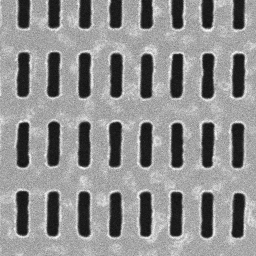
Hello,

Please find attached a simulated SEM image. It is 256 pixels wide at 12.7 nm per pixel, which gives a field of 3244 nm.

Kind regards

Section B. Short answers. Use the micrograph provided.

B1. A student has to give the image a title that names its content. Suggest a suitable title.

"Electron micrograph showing a regular array of holes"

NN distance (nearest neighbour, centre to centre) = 386 nm